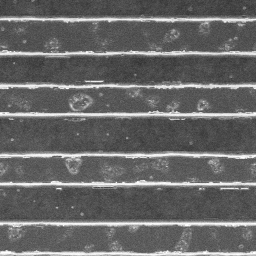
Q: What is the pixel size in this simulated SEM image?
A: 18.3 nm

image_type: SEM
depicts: one or a few lines or trenches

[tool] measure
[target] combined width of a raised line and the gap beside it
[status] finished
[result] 1230 nanometers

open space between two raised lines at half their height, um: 0.728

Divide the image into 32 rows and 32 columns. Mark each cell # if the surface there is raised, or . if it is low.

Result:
................................
................................
#########..................#....
################################
################################
################################
################################
................................
................................
................................
................................
################################
################################
################################
................................
................................
................................
................................
................................
...###############.########.....
################################
################################
################################
................................
................................
................................
................................
................................
################################
################################
################################
################################